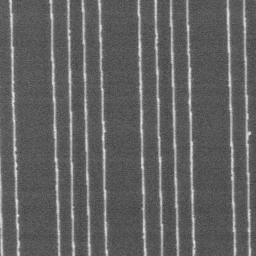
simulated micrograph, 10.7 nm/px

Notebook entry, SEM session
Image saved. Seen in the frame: lines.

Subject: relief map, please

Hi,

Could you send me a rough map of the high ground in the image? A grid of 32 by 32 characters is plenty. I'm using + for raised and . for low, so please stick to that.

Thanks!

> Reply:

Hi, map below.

+.....+++.++.....++..++.....+++.
+.....+++.++.....++..++.....+++.
+......++.++.....++..++.....+++.
+......++.+++....++..+++.....++.
+......++.+++....+++.+++.....++.
++.....++.+++....++..+++.....++.
++.....++..++....+++.+++.....++.
++.....++..++.....++..++.....++.
++.....++..++.....++..++.....++.
++.....++..++.....++..++.....++.
++.....++..++.....++..++.....++.
++.....++..++.....++..++.....++.
++.....++..++.....++..++.....++.
++.....++..++.....++..++.....++.
++.....++..++.....++..++.....++.
++.....++..++.....++..++.....++.
++.....++..++.....++..++.....++.
++.....++..++.....++..++.....++.
++.....++..++.....++..++.....++.
++.....++..++.....++..++.....++.
++.....++..++.....++..++.....++.
++.....++..++.....++..++.....++.
++.....++..++.....++..++.....++.
++.....++..++.....++..++.....++.
++.....++..++.....++..++.....++.
++.....++..++.....++..++.....++.
++.....++..++.....++..++.....++.
++.....++..++.....++..++.....++.
++.....++..++.....++..++.....++.
++.....++..++.....++..++.....++.
++.....++..++.....++..++.....++.
++.....++..++.....++..++.....++.